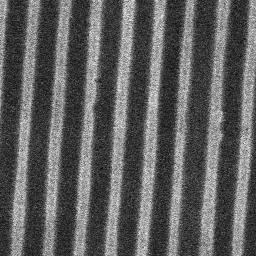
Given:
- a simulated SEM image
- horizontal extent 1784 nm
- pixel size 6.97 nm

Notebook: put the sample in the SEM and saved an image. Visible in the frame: parallel lines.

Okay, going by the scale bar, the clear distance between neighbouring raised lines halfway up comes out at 129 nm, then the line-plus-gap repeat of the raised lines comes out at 220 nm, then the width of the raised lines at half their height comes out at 89.5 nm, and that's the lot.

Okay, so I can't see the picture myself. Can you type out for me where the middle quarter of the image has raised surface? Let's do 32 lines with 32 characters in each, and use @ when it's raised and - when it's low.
@-----@@-----@@@@-----@@-----@@@
@-----@@@----@@@------@@-----@@@
@-----@@@----@@@-----@@@-----@@@
@----@@@-----@@@-----@@@-----@@@
@----@@@-----@@@-----@@@-----@@-
-----@@@-----@@@-----@@@-----@@-
-----@@@-----@@@-----@@@-----@@-
-----@@@-----@@@-----@@@----@@@-
-----@@@-----@@@-----@@@----@@@-
-----@@@-----@@@-----@@@----@@@-
-----@@------@@@-----@@@----@@@-
-----@@-----@@@@-----@@@----@@@-
-----@@@----@@@@----@@@@----@@@-
-----@@@----@@@@----@@@-----@@@-
-----@@-----@@@@----@@@-----@@@-
-----@@-----@@@-----@@@@----@@--
-----@@-----@@@-----@@@-----@@@-
----@@@-----@@@-----@@@-----@@@-
----@@@-----@@@-----@@@-----@@--
----@@@-----@@@-----@@@-----@@--
----@@@-----@@@-----@@@-----@@--
----@@@-----@@@-----@@@----@@@--
----@@@-----@@@-----@@@----@@@--
----@@@-----@@@-----@@@----@@@--
----@@@-----@@@-----@@@----@@@--
----@@@-----@@@-----@@@----@@@--
----@@@-----@@@----@@@@----@@@--
---@@@@-----@@@----@@@@----@@@--
---@@@@-----@@@----@@@@----@@@--
---@@@@-----@@-----@@@@----@@@--
---@@@@-----@@-----@@@-----@@@--
---@@@@-----@@-----@@@-----@@@--